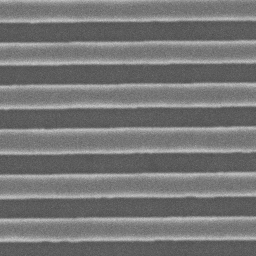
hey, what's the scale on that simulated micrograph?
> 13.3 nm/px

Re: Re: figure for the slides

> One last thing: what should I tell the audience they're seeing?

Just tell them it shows lines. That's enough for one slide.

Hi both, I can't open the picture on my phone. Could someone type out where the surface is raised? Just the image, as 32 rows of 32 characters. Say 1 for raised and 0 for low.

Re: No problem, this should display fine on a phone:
11111111111111111111111111111111
11111111111111111111111111111111
11111111111111111111111111111111
00000000000000000000000000000000
00000000000000000000000000000000
11111111111111111111111111111111
11111111111111111111111111111111
11111111111111111111111111111111
00000000000000000000000000000000
00000000000000000000000000000000
00000000000000000000000001111111
11111111111111111111111111111111
11111111111111111111111111111111
11111111000000000000000000000000
00000000000000000000000000000000
00000000000000000000000000000000
11111111111111111111111111111111
11111111111111111111111111111111
11111111111111111111111111111111
00000000000000000000000000000000
00000000000000000000000000000000
00000000000000000000000000000000
11111111111111111111111111111111
11111111111111111111111111111111
11111111111111111111111011100000
00000000000000000000000000000000
00000000000000000000000000000000
11111111111111111111111111111111
11111111111111111111111111111111
11111111111111111111111111111111
00000000000000000000000000000000
00000000000000000000000000000000